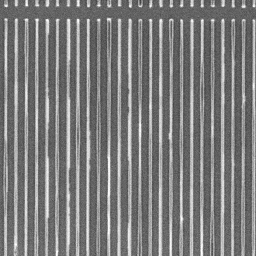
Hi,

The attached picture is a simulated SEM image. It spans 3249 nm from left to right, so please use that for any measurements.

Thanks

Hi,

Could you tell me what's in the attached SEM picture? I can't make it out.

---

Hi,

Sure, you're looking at parallel lines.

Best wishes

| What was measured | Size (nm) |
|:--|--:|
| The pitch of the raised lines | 131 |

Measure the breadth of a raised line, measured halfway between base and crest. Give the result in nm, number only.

23.8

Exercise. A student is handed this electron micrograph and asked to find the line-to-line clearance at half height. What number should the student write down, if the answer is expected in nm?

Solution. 102